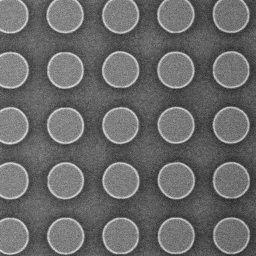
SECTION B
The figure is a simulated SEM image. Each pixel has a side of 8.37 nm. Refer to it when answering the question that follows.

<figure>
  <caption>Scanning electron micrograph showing an array of small figures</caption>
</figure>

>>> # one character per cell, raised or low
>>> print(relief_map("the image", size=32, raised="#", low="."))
###...####...####...####...####.
###...####...####...####...####.
###...####...####...####...####.
###....###....###...###....###..
................................
................................
............................#...
###...####...####...####...####.
###...####...####...####...####.
###...####...####...####...####.
###....###....##.....##.....##..
................................
................................
.#...................#......##..
###...####...####...####...####.
###...####...####...####...####.
###...####...####...####...####.
###....##.....##.....##.....##..
................................
................................
.#.....##.....##.....##.....##..
###...####...####...####...####.
###...####...####...####...####.
###...####...####...####...####.
##.....##.....##.....##.....##..
................................
................................
##.....##.....##.....##.....##..
###...####...####...####...####.
###...####...####...####...####.
###...####...####...####...####.
##.....##.....##.....##.....##..